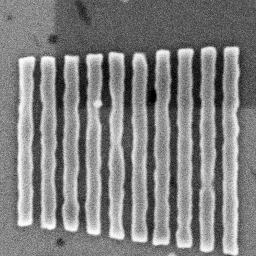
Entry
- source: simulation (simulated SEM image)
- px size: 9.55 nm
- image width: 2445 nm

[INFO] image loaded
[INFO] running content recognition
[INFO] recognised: groups of lines, slits or small figures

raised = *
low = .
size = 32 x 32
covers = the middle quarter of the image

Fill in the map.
***...***...***...***..***...***
***...***...***...***..***...***
***...***...***...***..***...***
***...***...***..****..****..***
***...***...***..****..****..***
.**...***...***..***...***...***
***...***...***..***...***...***
***...***...***..***...***...***
***...***...***..***...***...***
***...***...***..***...***...***
***...***...***..***...***...***
***...**....***..***...***...***
***...**....***..***...***...***
***...**....***..****..***...***
***...***...**...***...***...***
***...***...**...****..***...**.
***...***...**....***..***...***
***...***...**....***..***...***
***...***...**....***..***...***
***...***...**....***..***...***
***...***...**....**...***...***
***...***...**....**...***...***
***...***...**...***...***...***
***...***...***..***...***...**.
***...***...***..***...***...***
***...***...***...**...***...***
***...***...***..***...***...***
***...***...***..***...***...***
***...***...***..***...***...***
***...***...***..***...***...**.
***...***...***..***...***...***
***...***...***..***...***...***